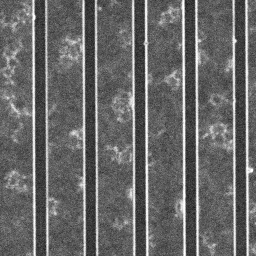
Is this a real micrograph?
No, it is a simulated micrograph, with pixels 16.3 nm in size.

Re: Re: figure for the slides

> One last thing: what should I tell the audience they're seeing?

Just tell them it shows parallel lines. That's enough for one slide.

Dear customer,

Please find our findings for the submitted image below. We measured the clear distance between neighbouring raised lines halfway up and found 210 nanometers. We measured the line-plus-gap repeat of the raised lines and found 50 pixels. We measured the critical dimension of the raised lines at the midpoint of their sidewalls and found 611 nm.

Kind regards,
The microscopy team